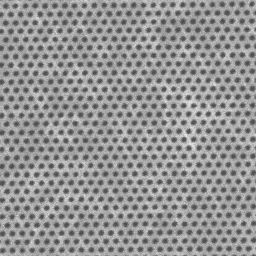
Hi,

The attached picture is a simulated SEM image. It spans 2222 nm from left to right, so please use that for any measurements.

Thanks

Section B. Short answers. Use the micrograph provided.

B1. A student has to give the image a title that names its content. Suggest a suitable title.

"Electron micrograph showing a regular array of holes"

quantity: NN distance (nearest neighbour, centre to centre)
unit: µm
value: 0.0828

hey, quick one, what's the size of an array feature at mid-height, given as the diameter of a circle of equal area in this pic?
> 52.7 nm